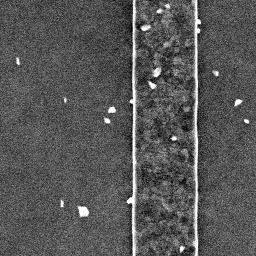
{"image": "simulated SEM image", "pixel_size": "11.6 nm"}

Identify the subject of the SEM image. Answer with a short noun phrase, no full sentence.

wiring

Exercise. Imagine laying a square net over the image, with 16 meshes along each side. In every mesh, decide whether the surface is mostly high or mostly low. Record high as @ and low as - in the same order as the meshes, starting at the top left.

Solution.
--------@@@@----
--------@@@@----
--------@@@@----
--------@@@@----
--------@@@@----
--------@@@@----
--------@@@@----
--------@@@@----
--------@@@@----
--------@@@@----
--------@@@@----
--------@@@@----
--------@@@@----
--------@@@@----
--------@@@@----
--------@@@@----